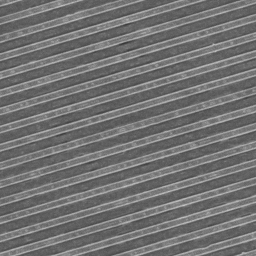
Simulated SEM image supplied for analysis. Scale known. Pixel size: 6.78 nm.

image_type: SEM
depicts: parallel lines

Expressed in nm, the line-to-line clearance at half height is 74.7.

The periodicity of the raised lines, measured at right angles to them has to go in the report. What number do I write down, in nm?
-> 118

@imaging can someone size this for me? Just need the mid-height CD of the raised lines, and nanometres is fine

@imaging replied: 43.1